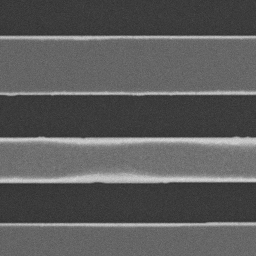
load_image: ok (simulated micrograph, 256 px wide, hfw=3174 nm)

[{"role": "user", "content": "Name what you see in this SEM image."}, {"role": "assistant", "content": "lines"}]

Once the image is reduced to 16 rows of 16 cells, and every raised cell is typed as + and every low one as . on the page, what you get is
................
................
++++++++++++++++
++++++++++++++++
++++++++++++++++
++++++++++++++++
................
................
................
++++++++++++++++
++++++++++++++++
................
................
................
++++++++++++++++
++++++++++++++++